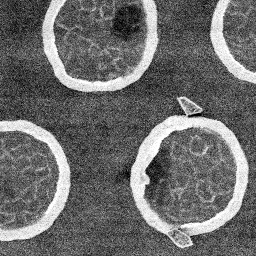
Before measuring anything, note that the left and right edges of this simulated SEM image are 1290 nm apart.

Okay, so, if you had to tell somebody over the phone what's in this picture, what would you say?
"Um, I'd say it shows raised bodies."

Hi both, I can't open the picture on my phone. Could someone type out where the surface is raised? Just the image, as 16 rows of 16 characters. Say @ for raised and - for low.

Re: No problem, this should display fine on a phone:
---@@@@@@-----@@
---@@@@@@@----@@
---@@@@@@-----@@
---@@@@@@-----@@
----@@@@@------@
----------------
----------------
----------------
@@@-------@@@@--
@@@@-----@@@@@@-
@@@@-----@@@@@@-
@@@@----@@@@@@@-
@@@@-----@@@@@@-
@@@------@@@@@--
@@--------@@----
----------------